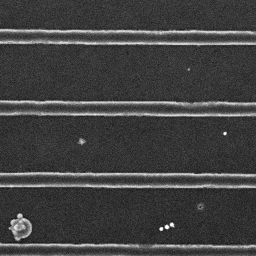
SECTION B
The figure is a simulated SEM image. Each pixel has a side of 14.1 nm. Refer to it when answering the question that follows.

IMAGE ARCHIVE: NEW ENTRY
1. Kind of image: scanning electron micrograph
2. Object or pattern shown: lines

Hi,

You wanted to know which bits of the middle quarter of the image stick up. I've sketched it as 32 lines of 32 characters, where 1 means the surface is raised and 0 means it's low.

00000000000000000000000000000000
00000000000000000000000000000000
00000000000000000000000000000000
00000000000000000000000000000000
00000000000000000000000000000000
00000000000000000000000000000000
00000000000000000000000000000000
00000000000000000000000000000000
00000000000000000000000000000000
00000000000000000000000000000000
11111111111111111111111111111111
11111111111111111111111111111111
01111111111111111111111111111111
00000000000000000000000000000000
00000000000000000000000000000000
00000000000000000000000000000000
00000000000000000000000000000000
00000000000000000000000000000000
00000000000000000000000000000000
00000000000000000000000000000000
00000000000000000000000000000000
00000000000000000000000000000000
00000000000000000000000000000000
00000000000000000000000000000000
00000000000000000000000000000000
00000000000000000000000000000000
00000000000000000000000000000000
11111111111111111111100100111111
11111111111111111111111111111111
11111111111111111111111111111111
11001111111111111111111111111111
00000000000000000000000000000000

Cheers